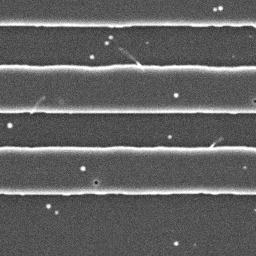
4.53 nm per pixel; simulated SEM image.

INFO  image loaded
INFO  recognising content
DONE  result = lines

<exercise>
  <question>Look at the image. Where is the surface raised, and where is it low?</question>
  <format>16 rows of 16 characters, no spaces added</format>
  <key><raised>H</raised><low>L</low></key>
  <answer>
HHHHHHHHHHHHHHHH
HHHHHHHHHHHHHHHH
LLLLLLLLLLLLLLLL
LLLLLLLLLLLLLLLL
HHHHHHHHHHHHHHHH
HHHHHHHHHHHHHHHH
HHHHHHHHHHHHHHHH
LLLLLLLLLLLLLLLL
LLLLLLLLLLLLLLLL
HHHHHHHHHHHHHHHH
HHHHHHHHHHHHHHHH
HHHHHHHHHHHHHHHH
LLLLLLLLLLLLLLLL
LLLLLLLLLLLLLLLL
LLLLLLLLLLLLLLLL
LLLLLLLLLLLLLLLL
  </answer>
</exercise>